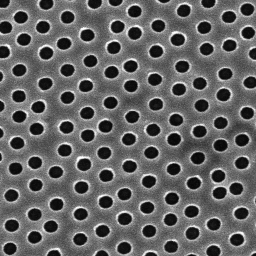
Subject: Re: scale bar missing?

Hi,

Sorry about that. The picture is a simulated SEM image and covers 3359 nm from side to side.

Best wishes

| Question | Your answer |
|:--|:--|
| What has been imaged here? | a regular array of holes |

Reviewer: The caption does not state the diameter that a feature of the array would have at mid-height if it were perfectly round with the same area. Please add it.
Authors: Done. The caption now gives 0.175 micrometres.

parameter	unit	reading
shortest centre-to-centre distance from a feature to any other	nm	296